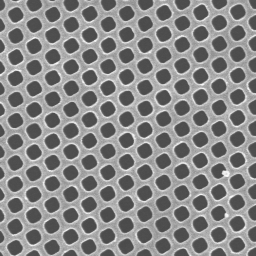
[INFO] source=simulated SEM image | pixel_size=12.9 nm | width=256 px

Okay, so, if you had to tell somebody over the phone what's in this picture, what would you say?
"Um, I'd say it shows a regular array of holes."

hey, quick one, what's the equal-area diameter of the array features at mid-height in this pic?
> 189 nanometers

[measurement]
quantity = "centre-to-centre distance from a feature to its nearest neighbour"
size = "270 nm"